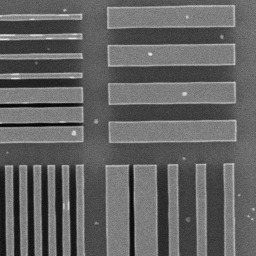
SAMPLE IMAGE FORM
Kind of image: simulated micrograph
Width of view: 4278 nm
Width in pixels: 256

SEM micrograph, groups of lines, slits or small figures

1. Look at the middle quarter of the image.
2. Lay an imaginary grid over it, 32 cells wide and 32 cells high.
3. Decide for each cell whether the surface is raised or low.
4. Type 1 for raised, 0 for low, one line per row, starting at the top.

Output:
00000000000000000000000000000000
00000000000000000000000000000000
11110000000000000000000000000000
00000000000000000000000000000000
00000000000000000000000000000000
00000000000111111111111111111111
11111000000111111111111111111111
11111000000111111111111111111111
11111000000111111111111111111111
11111000000111111111111111111111
00000000000000000000000000000000
11111000000000000000000000000000
11111000000000000000000000000000
11111000000000000000000000000000
11111000000000000000111111111111
00000000000111111111111111111111
11111000000111111111111111111111
11111000000111111111111111111111
11111000000111111111111111111111
11110000000111111111111110000000
00000000000000000000000000000000
00000000000000000000000000000000
00000000000000000000000000000000
00000000000000000000000000000000
00000000000000000000000000000000
10011000000111110011111000110000
10011000000111110011111000110000
10011000000111110011111000110000
10011000000111110011111000110000
10011000000111110011111000110000
10011000000111110011111000110000
10011000000111110011111000110000